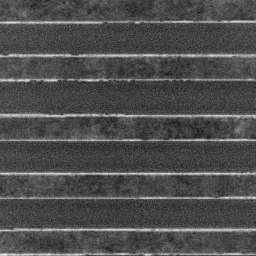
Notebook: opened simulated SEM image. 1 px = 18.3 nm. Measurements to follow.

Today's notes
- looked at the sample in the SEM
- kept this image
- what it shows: lines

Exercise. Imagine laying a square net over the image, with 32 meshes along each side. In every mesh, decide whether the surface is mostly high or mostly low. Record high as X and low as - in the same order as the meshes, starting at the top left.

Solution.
XXXXXXXXXXXXXXXXXXXXXXXXXXXXXXXX
XXXXXXXXXXXXXXXXXXXXXXXXXXXXXXXX
XXXXXXXXXXXXXXXXXXXXXXXXXXXXXXXX
--------------------------------
--------------------------------
--------------------------------
--------------------------------
XXXXXXXXXXXXXXXXXXXXXXXXXXXXXXXX
XXXXXXXXXXXXXXXXXXXXXXXXXXXXXXXX
XXXXXXXXXXXXXXXXXXXXXXXXXXXXXXXX
--------------------------------
--------------------------------
--------------------------------
--------------------------------
--------------------------------
XXXXXXXXXXXXXXXXXXXXXXXXXXXXXXXX
XXXXXXXXXXXXXXXXXXXXXXXXXXXXXXXX
--------------------------------
--------------------------------
--------------------------------
--------------------------------
--------------------------------
XXXXXXXXXXXXXXXXXXXXXXXXXXXXXXXX
XXXXXXXXXXXXXXXXXXXXXXXXXXXXXXXX
XXXXXXXXXXXXXXXXXXXXXXXXXXXXXXXX
--------------------------------
--------------------------------
--------------------------------
--------------------------------
XXXXXXXXXXXXXXXXXXXXXXXXXXXXXXXX
XXXXXXXXXXXXXXXXXXXXXXXXXXXXXXXX
XXXXXXXXXXXXXXXXXXXXXXXXXXXXXXXX